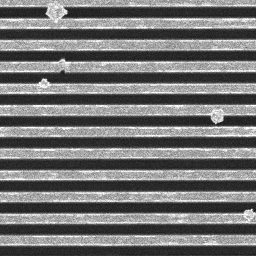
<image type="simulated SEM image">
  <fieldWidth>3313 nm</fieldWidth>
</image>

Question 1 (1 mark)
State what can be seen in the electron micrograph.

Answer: parallel lines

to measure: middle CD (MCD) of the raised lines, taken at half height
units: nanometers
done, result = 157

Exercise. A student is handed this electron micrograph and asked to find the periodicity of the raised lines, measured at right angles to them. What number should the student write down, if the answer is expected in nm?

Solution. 280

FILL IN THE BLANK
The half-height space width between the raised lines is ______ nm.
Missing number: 123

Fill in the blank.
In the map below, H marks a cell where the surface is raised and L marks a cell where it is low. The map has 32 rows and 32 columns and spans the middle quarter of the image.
HHHHHHHHHHHHHHHHHHHHHHHHHHHHHHHH
HHHHHHHHHHHHHHHHHHHHHHHHHHHHHHHH
LLLLLLLLLLLLLLLLLLLLLLLLLLLLLLLL
LLLLLLLLLLLLLLLLLLLLLLLLLLLLLLLL
LLLLLLLLLLLLLLLLLLLLLLLLLLLLLLLL
HHHHHHHHHHHHHHHHHHHHHHHHHHHHHHHH
HHHHHHHHHHHHHHHHHHHHHHHHHHHHHHHH
HHLLLLLLLLHHLHHHHHHHHHHHHHHHHHHH
LLLLLLLLLLLLLLLLLLLLLLLLLLLLLLLL
LLLLLLLLLLLLLLLLLLLLLLLLLLLLLLLL
HHHHHHHHHHHHHHHHHHHHHHHHHHHHHHHH
HHHHHHHHHHHHHHHHHHHHHHHHHHHHHHHH
HHHHHHHHHHHHHHHHHHHHHHHHHHHHHHHH
LLLLLLLLLLLLLLLLLLLLLLLLLLLLLLLL
LLLLLLLLLLLLLLLLLLLLLLLLLLLLLLLL
LLLLLLLLLLLLLLLLLLLLLLLLLLLLLLLL
HHHHHHHHHHHHHHHHHHHHHHHHHHHHHHHH
HHHHHHHHHHHHHHHHHHHHHHHHHHHHHHHH
LLLLLLLLLLLLLLLLLLLLLLLLLLLLLLLL
LLLLLLLLLLLLLLLLLLLLLLLLLLLLLLLL
LLLLLLLLLLLLLLLLLLLLLLLLLLLLLLLL
HHHHHHHHHHHHHHHHHHHHHHHHHHHHHHHH
HHHHHHHHHHHHHHHHHHHHHHHHHHHHHHHH
HHHHHHHHHHHHHHHHHHHHHHHHHHHHHHHH
LLLLLLLLLLLLLLLLLLLLLLLLLLLLLLLL
LLLLLLLLLLLLLLLLLLLLLLLLLLLLLLLL
HHHHHHHHHHHHHHHHHHHHHHHHHHHHHHHH
HHHHHHHHHHHHHHHHHHHHHHHHHHHHHHHH
HHHHHHHHHHHHHHHHHHHHHHHHHHHHHHHH
LLLLLLLLLLLLLLLLLLLLLLLLLLLLLLLL
LLLLLLLLLLLLLLLLLLLLLLLLLLLLLLLL
LLLLLLLLLLLLLLLLLLLLLLLLLLLLLLLL